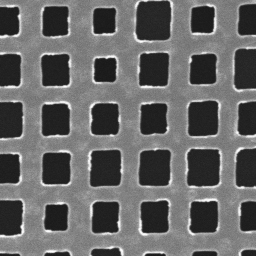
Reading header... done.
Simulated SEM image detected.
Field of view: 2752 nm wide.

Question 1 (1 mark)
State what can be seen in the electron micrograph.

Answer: a regular array of holes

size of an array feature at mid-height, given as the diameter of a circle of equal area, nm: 355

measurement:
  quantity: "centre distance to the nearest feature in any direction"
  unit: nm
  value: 524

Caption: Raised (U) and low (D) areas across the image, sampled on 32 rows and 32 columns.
UUUUUUUUUUUUUUUUUDDDDUUUUUUUUUUD
DDUUUDDDDUUUDDDUUDDDDUUUDDDUUUDD
DDUUUDDDDUUUDDDUUDDDDUUUDDDUUUDD
DDUUUDDDDUUUDDUUUDDDDUUUDDDUUUDD
UUUUUUDUUUUUUUUUUDDDDUUUUUUUUUUU
UUUUUUUUUUUUUUUUUUUUUUUUUUUUUUUU
UUUUUUUUUUUUUUUUUUUUUUUUUUUUUDDD
DDDUUDDDDUUUDDUUUDDDDUUUDDDUUDDD
DDDUUDDDDUUUDDDUUDDDDUUUDDDUUDDD
DDDUUDDDDUUUDDDUUDDDDUUUDDDUUDDD
DDUUUDDDUUUUUUUUUUDDDUUUDDDUUDDD
UUUUUUUUUUUUUUUUUUUUUUUUUUUUUUUU
UUUUUUUUUUUUUUUUUUUUUUUUUUUUUUUU
DDDUUDDDDUUUDDDUUUDDDUUUDDDUUUDD
DDDUUDDDDUUDDDDUUUDDDUUDDDDUUUDD
DDDUUDDDDUUDDDDUUDDDDUUDDDDUUUDD
DDDUUDDDDUUUDDDUUUDDDUUDDDDUUUDD
UUUUUUUUUUUUUUUUUUUUUUUUUUUUUUUU
UUUUUUUUUUUUUUUUUUUUUUUUUUUUUUUU
DDUUUDDDDUUDDDDUUDDDDUUDDDDDUUDD
DDUUUDDDDUUDDDDUUDDDDUUDDDDDUUDD
DDDUUDDDDUUDDDDUUDDDDUUDDDDDUDDD
DDUUUDDDDUUDDDDUUDDDDUUDDDDUUDDD
UUUUUUUUUUUUUUUUUUUUUUUUUUUUUUUU
UUUUUUUUUUUUUUUUUUUUUUUUUUUUUUUU
DDDUUUUDUUUUDDDUUUDDDUUUDDDUUUDD
DDDUUUDDDUUDDDDUUUDDDUUUDDDUUUDD
DDDUUUDDDUUDDDDUUUDDDUUUDDDUUUDD
DDDUUUDDUUUDDDDUUUDDDUUUDDDUUUDD
UUUUUUUUUUUUUUUUUUUUUUUUUUUUUUUU
UUUUUUUUUUUUUUUUUUUUUUUUUUUUUUUU
UUUUUUUUUUUUDDDUUUUUUUUUDDDUUUDD